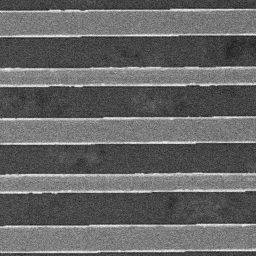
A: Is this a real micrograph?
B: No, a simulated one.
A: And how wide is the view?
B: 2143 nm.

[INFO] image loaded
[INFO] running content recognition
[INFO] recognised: lines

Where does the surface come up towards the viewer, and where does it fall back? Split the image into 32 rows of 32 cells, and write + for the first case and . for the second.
................................
++++++++++++++++++++++++++++++++
++++++++++++++++++++++++++++++++
++++++++++++++++++++++++++++++++
+++.............................
................................
................................
................................
................................
++++++++++++++++++++++++++++++++
++++++++++++++++++++++++++++++..
................................
................................
................................
................................
++++++++++++++++++++++++++++++++
++++++++++++++++++++++++++++++++
++++++++++++++++++++++++++++++++
................................
................................
................................
................................
++++++++++++++++++++++++++++++++
++++++++++++++++++++++++++++++++
................................
................................
................................
................................
++++++++++++++++++++++++++++++++
++++++++++++++++++++++++++++++++
++++++++++++++++++++++++++++++++
++++++++........................